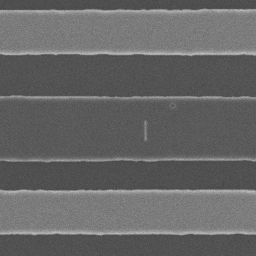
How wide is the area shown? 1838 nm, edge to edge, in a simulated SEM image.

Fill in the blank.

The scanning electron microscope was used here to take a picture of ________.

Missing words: lines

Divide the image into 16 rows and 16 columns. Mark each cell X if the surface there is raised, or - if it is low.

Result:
----------------
XXXXXXXXXXXXXXXX
XXXXXXXXXXXXXXXX
----------------
----------------
----------------
XXXXXXXXXXXXXXXX
XXXXXXXXXXXXXXXX
XXXXXXXXXXXXXXXX
XXXXXXXXXXXXXXXX
----------------
----------------
XXXXXXXXXXXXXXXX
XXXXXXXXXXXXXXXX
XXXXXXXXXXXXXXXX
----------------